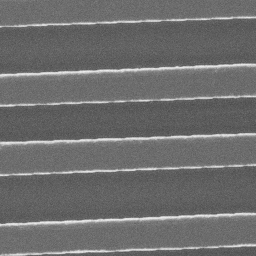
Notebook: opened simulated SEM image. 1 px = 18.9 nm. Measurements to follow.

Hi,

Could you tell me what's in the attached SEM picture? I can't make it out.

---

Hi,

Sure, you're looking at lines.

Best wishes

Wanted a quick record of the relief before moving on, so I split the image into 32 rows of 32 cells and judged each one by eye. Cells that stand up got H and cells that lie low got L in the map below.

HHHHHHHHHHHHHHHHHHHHHHHHHHHHHHHH
HHHHHHHHHHHHHHHHHHHHHHHHHHHHHHHH
HHHHHHHHHHHHHHHHHHHHHHHLLLLLLLLL
LLLLLLLLLLLLLLLLLLLLLLLLLLLLLLLL
LLLLLLLLLLLLLLLLLLLLLLLLLLLLLLLL
LLLLLLLLLLLLLLLLLLLLLLLLLLLLLLLL
LLLLLLLLLLLLLLLLLLLLLLLLLLLLLLLL
LLLLLLLLLLLLLLLLLLLLLLLLLLLLLLLL
LLLLLLLLLLLLLLLLLLLLHHHHHHHHHHHH
HHHHHHHHHHHHHHHHHHHHHHHHHHHHHHHH
HHHHHHHHHHHHHHHHHHHHHHHHHHHHHHHH
HHHHHHHHHHHHHHHHHHHHHHHHHHHHHHHH
HHHHHHHHHHHHHHHHHHHLLLLLLLLLLLLL
LLLLLLLLLLLLLLLLLLLLLLLLLLLLLLLL
LLLLLLLLLLLLLLLLLLLLLLLLLLLLLLLL
LLLLLLLLLLLLLLLLLLLLLLLLLLLLLLLL
LLLLLLLLLLLLLLLLLLLLLLLLLLLLLLLL
LLLLLLLLLLHHHHHHHHHHHHHHHHHHHHHH
HHHHHHHHHHHHHHHHHHHHHHHHHHHHHHHH
HHHHHHHHHHHHHHHHHHHHHHHHHHHHHHHH
HHHHHHHHHHHHHHHHHHHHHHHHHHHHHHHH
HHHHHHHHHLLLLLLLLLLLLLLLLLLLLLLL
LLLLLLLLLLLLLLLLLLLLLLLLLLLLLLLL
LLLLLLLLLLLLLLLLLLLLLLLLLLLLLLLL
LLLLLLLLLLLLLLLLLLLLLLLLLLLLLLLL
LLLLLLLLLLLLLLLLLLLLLLLLLLLLLLLL
LLLLLLLLLLLLLLLLLLLLLLLLLLLLLLLL
LLLLLLLLLLLLLHHHHHHHHHHHHHHHHHHH
HHHHHHHHHHHHHHHHHHHHHHHHHHHHHHHH
HHHHHHHHHHHHHHHHHHHHHHHHHHHHHHHH
HHHHHHHHHHHHHHHHHHHHHHHHHHHHHHHH
HHHHHHHHHHLLLLLLLLLLLLLLLLLLLLLL